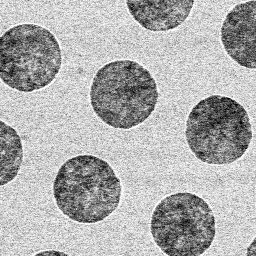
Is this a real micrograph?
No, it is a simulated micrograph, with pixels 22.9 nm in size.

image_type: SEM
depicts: holes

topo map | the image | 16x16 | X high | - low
XXXXXXXX----XXX-
X-XXXXXXX--XXX--
----XXXXXXXXXX--
----XXXXXXXXXX--
----XX---XXXXXXX
X--XXX----XXXXXX
XXXXXX----XX---X
XXXXXX---XXX----
-XXXXXXXXXXX----
-XXXXXXXXXXX---X
-XXX---XXXXXXXXX
XXX-----XXXXXXXX
XXX-----XX---XXX
XXXX---XX----XXX
XXXXXXXXX----XXX
XXXXXXXXXX---XX-